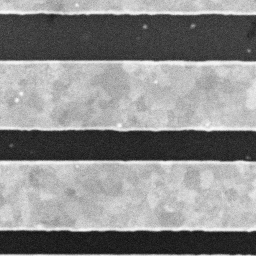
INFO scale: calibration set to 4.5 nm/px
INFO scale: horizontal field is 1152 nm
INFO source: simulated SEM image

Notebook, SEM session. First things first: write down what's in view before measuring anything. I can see lines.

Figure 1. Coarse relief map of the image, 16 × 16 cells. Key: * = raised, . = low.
****************
................
................
................
****************
****************
****************
****************
................
................
****************
****************
****************
****************
................
................